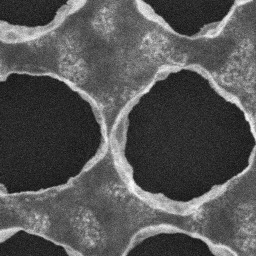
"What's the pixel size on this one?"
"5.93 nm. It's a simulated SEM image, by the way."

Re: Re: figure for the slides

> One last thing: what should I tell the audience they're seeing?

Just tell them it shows holes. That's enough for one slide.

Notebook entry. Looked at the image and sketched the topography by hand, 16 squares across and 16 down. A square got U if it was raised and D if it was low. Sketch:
DDDDUUUUUDDDDDDU
DDDDUUUUUUDDDDUU
UUUUUUUUUUUUUUUU
UUUUUUUUUUUUUUUU
UUUUUUUUUUDDUUUU
DDDDUUUUUDDDDUUU
DDDDDDUUDDDDDDDU
DDDDDDUUDDDDDDDU
DDDDDDUDDDDDDDDD
DDDDDDUUDDDDDDDD
DDDDDUUUDDDDDDDU
DDDDUUUUUDDDDDUU
UUUUUUUUUUDDUUUU
UUUUUUUUUUUUUUUU
UDUUUUUUUDDUUUUU
DDDDUUUUDDDDDUUU